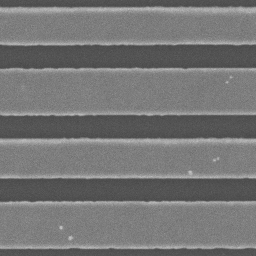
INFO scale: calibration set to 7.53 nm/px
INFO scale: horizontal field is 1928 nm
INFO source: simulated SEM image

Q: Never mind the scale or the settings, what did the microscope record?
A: lines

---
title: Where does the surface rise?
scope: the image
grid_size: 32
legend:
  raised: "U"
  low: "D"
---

DDDDDDDDDDDDDDDDDDDDDDDDDDDDDDDD
UUUUUUUUUUUUUUUUUUUUUUUUUUUUUUUU
UUUUUUUUUUUUUUUUUUUUUUUUUUUUUUUU
UUUUUUUUUUUUUUUUUUUUUUUUUUUUUUUU
UUUUUUUUUUUUUUUUUUUUUUUUUUUUUUUU
UUUUUUUUUUUUUUUUUUUUDUDDDDDDDUUD
DDDDDDDDDDDDDDDDDDDDDDDDDDDDDDDD
DDDDDDDDDDDDDDDDDDDDDDDDDDDDDDDD
DDDDDDDDDDDDDDDDDDDDDDDDDDDDDDDD
UUUUUUUUUUUUUUUUUUUUUUUUUUUUUUUU
UUUUUUUUUUUUUUUUUUUUUUUUUUUUUUUU
UUUUUUUUUUUUUUUUUUUUUUUUUUUUUUUU
UUUUUUUUUUUUUUUUUUUUUUUUUUUUUUUU
UUUUUUUUUUUUUUUUUUUUUUUUUUUUUUUU
DDDDDDDDDDDDDDDDDDDDDDDDDDDDDDDD
DDDDDDDDDDDDDDDDDDDDDDDDDDDDDDDD
DDDDDDDDDDDDDDDDDDDDDDDDDDDDDDDD
UUUUUUUUUUUUUUUUUUUUUUUUUUUUUUUU
UUUUUUUUUUUUUUUUUUUUUUUUUUUUUUUU
UUUUUUUUUUUUUUUUUUUUUUUUUUUUUUUU
UUUUUUUUUUUUUUUUUUUUUUUUUUUUUUUU
UUUUUUUUUUUUUUUUUUUUUUUUUUUUUUUU
DDDDDDDDDDDDDDDDDDDDDDDDDDDDDDDD
DDDDDDDDDDDDDDDDDDDDDDDDDDDDDDDD
DDDDDDDDDDDDDDDDDDDDDDDDDDDDDDDD
UUUUUUUUUUUUUUUUUUUUUUUUUUUUUUUU
UUUUUUUUUUUUUUUUUUUUUUUUUUUUUUUU
UUUUUUUUUUUUUUUUUUUUUUUUUUUUUUUU
UUUUUUUUUUUUUUUUUUUUUUUUUUUUUUUU
UUUUUUUUUUUUUUUUUUUUUUUUUUUUUUUU
UUUUUUUUUUUUUUUUUUUUUUUUUUUUUUUU
DDDDDDDDDDDDDDDDDDDDDDDDDDDDDDDD